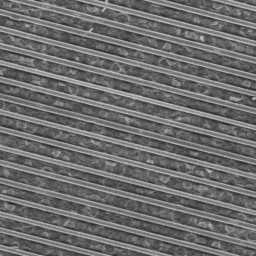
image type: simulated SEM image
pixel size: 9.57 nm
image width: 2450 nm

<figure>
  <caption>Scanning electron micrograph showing parallel lines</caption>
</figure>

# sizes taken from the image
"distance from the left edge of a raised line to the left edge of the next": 156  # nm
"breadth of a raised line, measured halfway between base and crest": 0.0382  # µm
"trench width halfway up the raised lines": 0.114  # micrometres